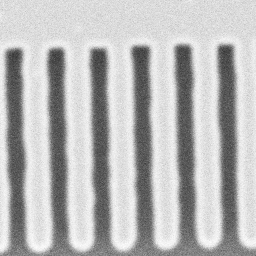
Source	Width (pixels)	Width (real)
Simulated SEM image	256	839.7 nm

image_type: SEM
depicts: groups of lines, slits or small figures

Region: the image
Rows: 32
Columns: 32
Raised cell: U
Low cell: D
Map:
UUUUUUUUUUUUUUUUUUUUUUUUUUUUUUUU
UUUUUUUUUUUUUUUUUUUUUUUUUUUUUUUU
UUUUUUUUUUUUUUUUUUUUUUUUUUUUUUUU
UUUUUUUUUUUUUUUUUUUUUUUUUUUUUUUU
UUUUUUUUUUUUUUUUUUUUUUUUUUUUUUUU
UUUUUUUUUUUUUUUUUDUUUUDDUUUDDUUU
UDDUUUDDUUUDDUUUDDDUUUDDUUUDDUUU
DDDUUUDDUUUDDDUUDDDUUUDDUUUDDUUU
UDDUUUDDUUUDDDUUDDDUUUDDUUUDDUUU
DDDUUUDDUUUDDDUUDDDUUUDDUUUDDDUU
UDDUUUDDUUUDDDUUDDDUUUDDUUUDDDUU
UDDUUUDDUUUDDDUUUDDUUUDDUUUDDDUU
UDDUUUDDUUUDDDUUUDDUUUDDUUUDDDUU
UDDUUUDDUUUDDDUUUDDUUUDDUUUDDDUU
UDDUUUDDUUUDDDUUUDDUUUDDUUUDDDUU
UDDUUUDDUUUDDDUUUDDUUUDDUUUDDDUU
UDDUUUDDDUUDDDUUUDDUUUDDUUUDDDUU
UDDUUUDDDUUDDDUUUDDUUUDDUUUDDDUU
UDDUUUDDUUUDDDUUUDDUUUDDDUUDDDUU
UDDUUUDDUUUDDDUUUDDUUUDDDUUDDDUU
UDDUUUDDDUUDDDUUUDDUUUDDDUUDDDUU
UDDUUUDDDUUDDDUUUDDUUUDDDUUDDDUU
UDDUUUDDDUUDDDUUUDDUUUDDDUUDDDUU
UDDUUUDDDUUUDDUUUDDUUUDDDUUDDDUU
UDDUUUDDDUUUDDUUUDDUUUDDDUUDDDUU
UDDUUUDDDUUUDDUUUDDUUUDDDUUDDDUU
UDDUUUDDDUUDDDUUUDDUUUDDDUUUDDUU
UDDUUUDDDUUUDDUUUDDUUUDDDUUUDDUU
UDDUUUDDDUUUDDUUUDDUUUDDDUUUDDUU
UDDUUUDDDUUUDDUUUDDUUUDDDUUUDDUU
UDDDUUDDDUUDDDUUUDDDUUDDDUUDDDDU
DDDDDDDDDDDDDDDDDDDDDDDDDDDDDDDD